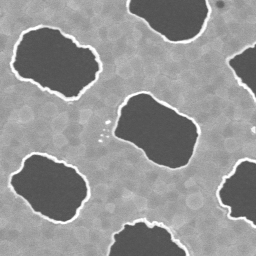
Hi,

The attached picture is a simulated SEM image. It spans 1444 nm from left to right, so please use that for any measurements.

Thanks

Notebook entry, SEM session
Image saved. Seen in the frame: holes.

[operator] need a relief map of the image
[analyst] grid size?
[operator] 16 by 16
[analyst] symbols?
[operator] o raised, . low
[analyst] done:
oooooooo.....ooo
ooooooooo....ooo
o...ooooooo.oooo
o.....ooooooooo.
o.....ooooooooo.
ooo..oooooooooo.
oooooooo..oooooo
ooooooo.....oooo
ooooooo.....oooo
ooooooooo...oooo
o...ooooooooooo.
o....ooooooooo..
oo...ooooooooo..
ooo..oooooooooo.
ooooooo....ooooo
ooooooo....ooooo